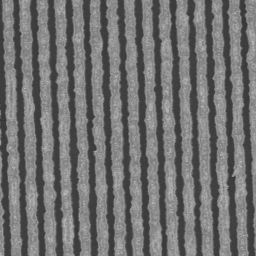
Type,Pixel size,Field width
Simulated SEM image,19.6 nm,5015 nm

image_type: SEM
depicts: parallel lines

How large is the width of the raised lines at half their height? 196 nanometers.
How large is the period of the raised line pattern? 341 nanometres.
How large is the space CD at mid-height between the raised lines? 142 nanometres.